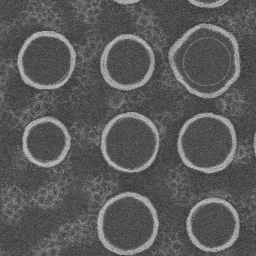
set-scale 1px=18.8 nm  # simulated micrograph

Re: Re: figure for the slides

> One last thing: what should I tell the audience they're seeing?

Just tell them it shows a regular array of raised bodies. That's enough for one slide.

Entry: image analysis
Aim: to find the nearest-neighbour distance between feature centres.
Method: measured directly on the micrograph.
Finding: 1500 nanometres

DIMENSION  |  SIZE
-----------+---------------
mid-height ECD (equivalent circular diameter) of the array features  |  1030 nm